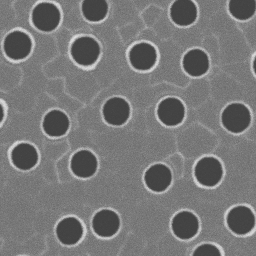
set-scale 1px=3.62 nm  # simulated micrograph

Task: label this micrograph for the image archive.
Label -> a regular array of holes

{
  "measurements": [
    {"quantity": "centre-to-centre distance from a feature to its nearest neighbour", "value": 50.9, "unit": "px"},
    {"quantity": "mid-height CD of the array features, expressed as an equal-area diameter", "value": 99.6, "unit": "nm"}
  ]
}